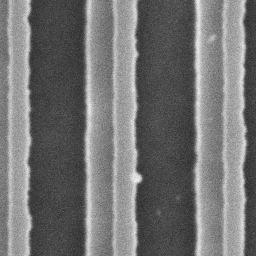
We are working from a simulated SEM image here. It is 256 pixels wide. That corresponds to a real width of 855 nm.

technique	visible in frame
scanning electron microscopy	lines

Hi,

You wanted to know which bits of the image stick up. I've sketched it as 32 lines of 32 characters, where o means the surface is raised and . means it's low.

oooo.......oooooo........ooooo..
oooo.......oooooo........oooooo.
ooo........oooooo........ooooo..
oooo.......oooooo........ooooo..
oooo.......oooooo........ooooo..
oooo.......oooooo........oooooo.
oooo.......oooooo........ooooo..
ooo........oooooo........ooooo..
oooo.......oooooo........ooooo..
oooo.......oooooo........ooooo..
ooo........oooooo........ooooo..
oooo.......oooooo........ooooo..
ooo........oooooo........ooooo..
oooo.......oooooo........ooooo..
ooo........oooooo........ooooo..
oooo.......oooooo........ooooo..
oooo.......oooooo........oooooo.
oooo.......oooooo........oooooo.
oooo.......oooooo........oooooo.
ooo........oooooo........ooooo..
ooo........oooooo........ooooo..
oooo.......oooooo........ooooo..
oooo.......oooooo........ooooo..
ooo........oooooo........ooooo..
ooo........oooooo........oooooo.
ooo........oooooo........oooooo.
oooo.......oooooo........ooooo..
oooo.......oooooo........ooooo..
oooo.......oooooo........ooooo..
ooo........oooooo........ooooo..
oooo.......oooooo........ooooo..
oooo.......oooooo........ooooo..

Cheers